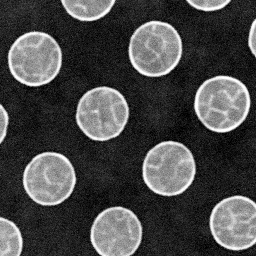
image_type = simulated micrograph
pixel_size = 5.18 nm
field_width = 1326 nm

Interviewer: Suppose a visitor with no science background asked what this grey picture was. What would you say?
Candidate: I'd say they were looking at raised bodies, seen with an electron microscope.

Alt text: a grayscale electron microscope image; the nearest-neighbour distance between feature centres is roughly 435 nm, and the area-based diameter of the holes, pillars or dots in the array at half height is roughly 0.27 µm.